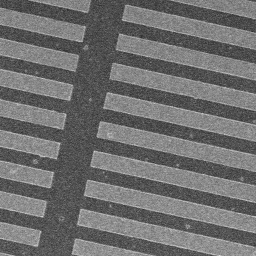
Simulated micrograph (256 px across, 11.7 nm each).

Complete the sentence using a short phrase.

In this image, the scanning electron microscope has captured parallel lines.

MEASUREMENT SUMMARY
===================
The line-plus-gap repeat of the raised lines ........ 346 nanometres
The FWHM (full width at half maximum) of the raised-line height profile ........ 183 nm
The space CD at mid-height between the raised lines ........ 163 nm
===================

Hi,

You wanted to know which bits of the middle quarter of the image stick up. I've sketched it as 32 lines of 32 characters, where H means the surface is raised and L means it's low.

HHHLLLLLLLLLHHHLLLLLLLLLLLLLLLLL
LHHLLLLLLLLLHHHHHHHHLLLLLLLLLLLL
LLLLLLLLLLLLHHHHHHHHHHHHLLLLLLLL
LLLLLLLLLLLLHHHHHHHHHHHHHHHHHLLL
LLLLLLLLLLLLLLLHHHHHHHHHHHHHHHHH
HHLLLLLLLLLLLLLLLLLLHHHHHHHHHHHH
HHLLLLLLLLLLLLLLLLLLLLLLHHHHHHHH
HHLLLLLLLLLHLLLLLLLLLLLLLLLLLHHH
HLLLLLLLLLLHHHHHHLLLLLLLLLLLLLLL
LLLLLLLLLLHHHHHHHHHHHLLLLLLLLLLL
LLLLLLLLLLHHHHHHHHHHHHHHHHLLLLLL
LLLLLLLLLLLLHHHHHHHHHHHHHHHHHHLL
LLLLLLLLLLLLLLLLLHHHHHHHHHHHHHHH
LLLLLLLLLLLLLLLLLLLLLLHHHHHHHHHH
LLLLLLLLLLLLLLLLLLLLLLLLLLHHHHHH
LLLLLLLLLHHHHHLLLLLLLLLLLLLLLLLH
LLLLLLLLLHHHHHHHHHHLLLLLLLLLLLLL
LLLLLLLLHHHHHHHHHHHHHHHLLLLLLLLL
LLLLLLLLLHHHHHHHHHHHHHHHHHHHLLLL
LLLLLLLLLLLLLLHHHHHHHHHHHHHHHHHH
LLLLLLLLLLLLLLLLLLHHHHHHHHHHHHHH
LLLLLLLLLLLLLLLLLLLLLLLHHHHHHHHH
LLLLLLLHHHHLLLLLLLLLLLLLLLLLHHHH
LLLLLLLHHHHHHHHLLLLLLLLLLLLLLLLL
LLLLLLLHHHHHHHHHHHHHLLLLLLLLLLLL
LLLLLLLHHHHHHHHHHHHHHHHHHLLLLLLL
LLLLLLLLLLLHHHHHHHHHHHHHHHHHHLLL
LLLLLLLLLLLLLLLLHHHHHHHHHHHHHHHH
LLLLLLLLLLLLLLLLLLLLHHHHHHHHHHHH
LLLLLLHHLLLLLLLLLLLLLLLLLHHHHHHH
LLLLLLHHHHHHLLLLLLLLLLLLLLLLLHHH
LLLLLHHHHHHHHHHHHLLLLLLLLLLLLLLL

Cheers